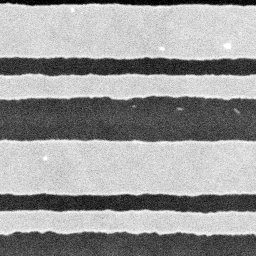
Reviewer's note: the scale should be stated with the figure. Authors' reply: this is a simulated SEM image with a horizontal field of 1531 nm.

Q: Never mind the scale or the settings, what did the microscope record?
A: lines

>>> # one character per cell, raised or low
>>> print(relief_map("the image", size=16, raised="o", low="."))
oooooooooooooooo
oooooooooooooooo
oooooooooooooooo
oooooooooooooooo
oooooooooooooooo
oooooooooooooooo
................
................
................
oooooooooooooooo
oooooooooooooooo
oooooooooooooooo
oooooooooooooooo
oooooooooooooooo
o...o...oooooooo
................